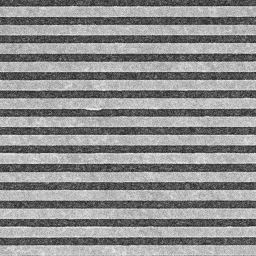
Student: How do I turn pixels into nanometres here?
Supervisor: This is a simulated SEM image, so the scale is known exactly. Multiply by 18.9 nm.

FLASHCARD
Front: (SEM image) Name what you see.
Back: parallel lines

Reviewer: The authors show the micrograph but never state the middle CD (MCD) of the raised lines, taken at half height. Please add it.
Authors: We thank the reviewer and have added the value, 185 nm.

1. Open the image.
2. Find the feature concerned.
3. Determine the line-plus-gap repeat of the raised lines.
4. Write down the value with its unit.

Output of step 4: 348 nanometres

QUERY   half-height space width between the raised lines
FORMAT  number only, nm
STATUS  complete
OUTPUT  161